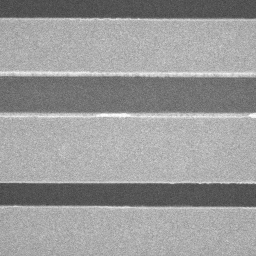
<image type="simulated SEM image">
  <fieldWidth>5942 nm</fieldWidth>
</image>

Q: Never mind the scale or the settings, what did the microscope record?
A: lines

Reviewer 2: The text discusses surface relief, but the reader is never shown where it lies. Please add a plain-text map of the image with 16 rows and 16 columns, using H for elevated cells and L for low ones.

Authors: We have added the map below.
LLLLLLLLLLLLLLLL
HHHHHHHHHHHHHHHH
HHHHHHHHHHHHHHHH
HHHHHHHHHHHHHHHH
HHHHHHHHHHHHHHHH
LLLLLLLLLLLLLLLL
LLLLLLLLLLLLLLLL
HHHHHHHHHHHHHHHH
HHHHHHHHHHHHHHHH
HHHHHHHHHHHHHHHH
HHHHHHHHHHHHHHHH
LLLLLLLLLLLLLLLL
LLLLLLLLLLLLLLLL
HHHHHHHHHHHHHHHH
HHHHHHHHHHHHHHHH
HHHHHHHHHHHHHHHH